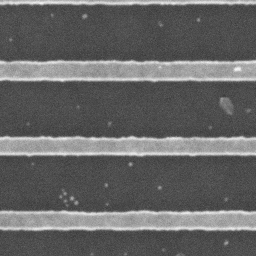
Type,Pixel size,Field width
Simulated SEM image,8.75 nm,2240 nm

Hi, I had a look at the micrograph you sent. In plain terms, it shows lines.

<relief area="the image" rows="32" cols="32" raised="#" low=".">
#........#.#.####.#.###.........
................................
................................
................................
................................
................................
................................
................................
################################
################################
................................
................................
................................
................................
................................
................................
................................
################################
################################
................................
................................
................................
................................
................................
................................
................................
##...####.......###........####.
################################
################################
................................
................................
................................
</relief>